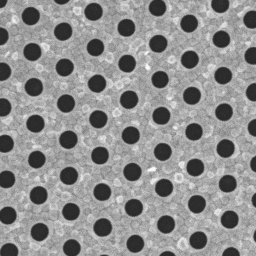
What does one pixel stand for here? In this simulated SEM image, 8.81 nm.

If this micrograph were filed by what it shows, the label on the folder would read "a regular array of holes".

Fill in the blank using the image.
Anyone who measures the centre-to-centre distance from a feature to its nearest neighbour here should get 35.8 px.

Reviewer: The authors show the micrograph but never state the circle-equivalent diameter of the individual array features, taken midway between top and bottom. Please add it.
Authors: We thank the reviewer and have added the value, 160 nm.